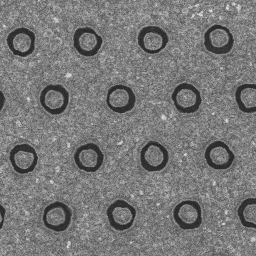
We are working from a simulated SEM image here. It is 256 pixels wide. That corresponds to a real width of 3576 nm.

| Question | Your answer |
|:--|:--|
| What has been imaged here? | a regular array of ring-shaped grooves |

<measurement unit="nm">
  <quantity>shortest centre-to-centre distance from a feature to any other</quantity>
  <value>905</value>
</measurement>